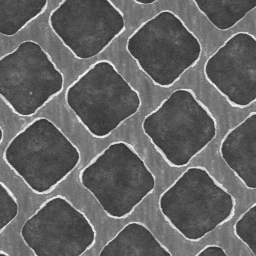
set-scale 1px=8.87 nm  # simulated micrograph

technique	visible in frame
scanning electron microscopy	holes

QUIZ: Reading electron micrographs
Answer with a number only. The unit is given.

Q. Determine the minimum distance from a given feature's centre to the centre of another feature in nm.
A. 710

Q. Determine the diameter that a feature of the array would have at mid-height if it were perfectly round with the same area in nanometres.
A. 585